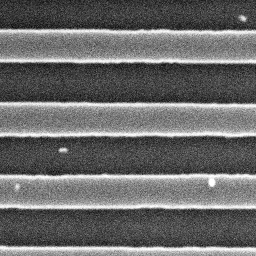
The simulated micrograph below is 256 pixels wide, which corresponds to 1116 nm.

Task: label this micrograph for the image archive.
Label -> lines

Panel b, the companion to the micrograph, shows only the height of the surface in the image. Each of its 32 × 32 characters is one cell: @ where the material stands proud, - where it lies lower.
--------------------------------
--------------------------------
--------------------------------
--------------------------------
@@@@@@@@@@@@@@@@@@@@@@@@@@@@@@@@
@@@@@@@@@@@@@@@@@@@@@@@@@@@@@@@@
@@@@@@@@@@@@@@@@@@@@@@@@@@@@@@@@
@@@@@@@@@@@@@@@@@@@@@@@@@@@@@@@@
--------------------------------
--------------------------------
--------------------------------
--------------------------------
--------------------------------
@@@@@@@@@@@@@@@@@@@@@@@@@@@@@@@@
@@@@@@@@@@@@@@@@@@@@@@@@@@@@@@@@
@@@@@@@@@@@@@@@@@@@@@@@@@@@@@@@@
@@@@@@@@@@@@@@@@@@@@@@@@@@@@@@@@
--------------------------------
--------------------------------
--------------------------------
--------------------------------
--------------------------------
@@@@@@@@@@@@@@@@@@@@@@@@@@@@@@@@
@@@@@@@@@@@@@@@@@@@@@@@@@@@@@@@@
@@@@@@@@@@@@@@@@@@@@@@@@@@@@@@@@
@@@@@@@@@@@@@@@@@@@@@@@@@@@@@@@@
--------------------------------
--------------------------------
--------------------------------
--------------------------------
--------------------------------
@@@@@@@@@@@@@@@@@@@@@@@@@@@@@@@@